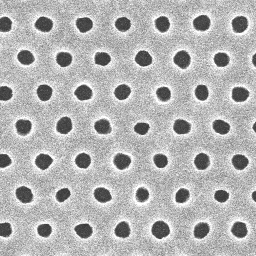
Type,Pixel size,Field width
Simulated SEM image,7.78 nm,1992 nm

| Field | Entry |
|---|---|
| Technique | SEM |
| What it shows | a regular array of holes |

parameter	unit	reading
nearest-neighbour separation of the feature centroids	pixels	38.3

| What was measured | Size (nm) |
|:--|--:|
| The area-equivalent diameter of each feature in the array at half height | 126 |